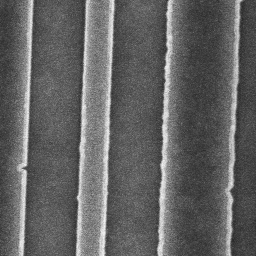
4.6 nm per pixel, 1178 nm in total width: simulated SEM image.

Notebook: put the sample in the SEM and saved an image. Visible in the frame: one or a few lines or trenches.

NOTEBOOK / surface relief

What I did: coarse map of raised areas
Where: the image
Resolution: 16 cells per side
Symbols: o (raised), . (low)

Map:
oo...oo....oooo.
oo...oo...ooooo.
oo...oo...ooooo.
oo...oo...ooooo.
oo...oo...ooooo.
oo...oo...ooooo.
oo...oo...ooooo.
oo...oo...ooooo.
oo...oo...ooooo.
oo...oo...ooooo.
oo...oo...ooooo.
oo...oo...oooo..
oo...oo...oooo..
oo...oo...oooo..
o....oo...oooo..
o....o....oooo..